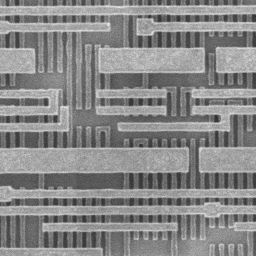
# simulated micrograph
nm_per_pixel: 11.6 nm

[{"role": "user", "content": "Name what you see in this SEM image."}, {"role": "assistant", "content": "wiring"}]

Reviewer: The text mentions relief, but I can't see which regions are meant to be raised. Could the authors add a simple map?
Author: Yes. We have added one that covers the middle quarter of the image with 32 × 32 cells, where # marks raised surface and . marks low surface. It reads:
.........#######################
.........#######################
................................
................................
................................
................................
..........##.############.......
........#################.......
................................
................................
................................
#.......#################.......
#.......#################.......
#...............................
#...............................
#.............##################
#.............##################
................................
................................
................................
................................
###############################.
###############################.
###############################.
###############################.
###############################.
###############################.
................................
................................
................................
................................
####..##########################